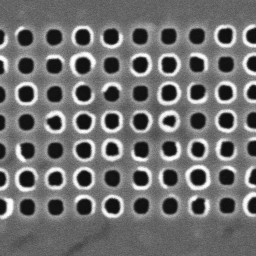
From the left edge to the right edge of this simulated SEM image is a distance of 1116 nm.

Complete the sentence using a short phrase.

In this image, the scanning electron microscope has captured a regular array of holes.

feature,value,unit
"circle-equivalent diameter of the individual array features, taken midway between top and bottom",0.0703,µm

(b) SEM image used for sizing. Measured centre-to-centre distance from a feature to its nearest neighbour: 0.123 um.